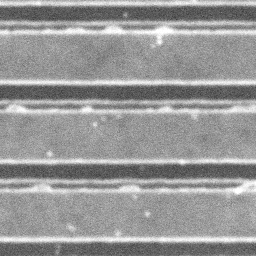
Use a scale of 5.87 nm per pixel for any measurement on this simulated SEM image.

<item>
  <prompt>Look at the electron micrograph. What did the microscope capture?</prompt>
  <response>lines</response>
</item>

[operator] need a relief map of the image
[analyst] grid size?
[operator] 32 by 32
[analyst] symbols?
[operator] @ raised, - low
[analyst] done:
----@---------------------------
--------------------------------
--------------------------------
--------------@-----@-----------
@@@@@@@@@@@@@@@@@@@@@@@@@@@@@@@@
@@@@@@@@@@@@@@@@@@@@@@@@@@@@@@@@
@@@@@@@@@@@@@@@@@@@@@@@@@@@@@@@@
@@@@@@@@@@@@@@@@@@@@@@@@@@@@@@@@
@@@@@@@@@@@@@@@@@@@@@@@@@@@@@@@@
@@@@@@@@@@@@@@@@@@@@@@@@@@@@@@@@
--------------------------------
--------------------------------
--------------------------------
-@-----------------------------@
@@@@@@@@@@@@@@@@@@@@@@@@@@@@@@@@
@@@@@@@@@@@@@@@@@@@@@@@@@@@@@@@@
@@@@@@@@@@@@@@@@@@@@@@@@@@@@@@@@
@@@@@@@@@@@@@@@@@@@@@@@@@@@@@@@@
@@@@@@@@@@@@@@@@@@@@@@@@@@@@@@@@
@@@@@@@@@@@@@@@@@@@@@@@@@@@@@@@@
--------------------------------
--------------------------------
--------------------------------
----@@----------@-------------@@
@@@@@@@@@@@@@@@@@@@@@@@@@@@@@@@@
@@@@@@@@@@@@@@@@@@@@@@@@@@@@@@@@
@@@@@@@@@@@@@@@@@@@@@@@@@@@@@@@@
@@@@@@@@@@@@@@@@@@@@@@@@@@@@@@@@
@@@@@@@@@@@@@@@@@@@@@@@@@@@@@@@@
@@@@@@@@@@@@@@@@@@@@@@@@@@@@@@@@
--------------------------------
--------------------------------